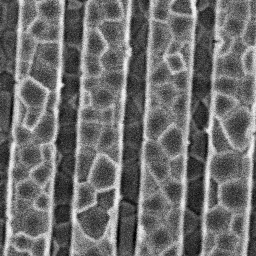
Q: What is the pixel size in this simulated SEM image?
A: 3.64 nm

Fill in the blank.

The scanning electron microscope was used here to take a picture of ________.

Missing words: one or a few lines or trenches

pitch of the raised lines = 239 nm